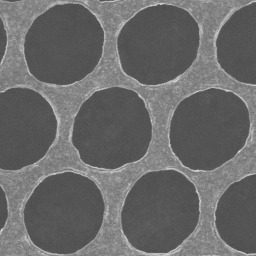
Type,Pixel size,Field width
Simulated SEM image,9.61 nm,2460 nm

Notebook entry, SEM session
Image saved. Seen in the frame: holes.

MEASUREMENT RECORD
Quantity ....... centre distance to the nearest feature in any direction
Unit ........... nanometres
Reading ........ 920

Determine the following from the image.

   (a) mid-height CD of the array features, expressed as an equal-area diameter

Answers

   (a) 782 nanometers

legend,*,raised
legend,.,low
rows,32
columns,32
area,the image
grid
********..*********************.
******.....******......******...
****........****........****....
.***.........**..........***....
.**..........**..........**.....
.**..........**..........**.....
.**..........**..........**.....
***.........***.........***.....
***.........***.........****....
****.......*****......*******...
*******..*********..***********.
.....*******.....********....***
......*****.......*****.......**
.......***........****.........*
.......**..........***.........*
.......**..........**..........*
.......**..........**..........*
.......**..........**..........*
......***..........**.........**
......****........****.......***
....*******.....*******.....****
********.**********...**********
*****......******.......******..
****........****........****....
.***.........***.........***....
.**..........**..........**.....
.**..........**..........**.....
.**..........**..........**.....
***..........**.........***.....
****........****........***.....
****.......*****.......*****....
******...*********...*********..